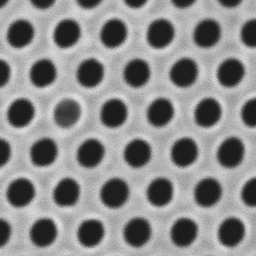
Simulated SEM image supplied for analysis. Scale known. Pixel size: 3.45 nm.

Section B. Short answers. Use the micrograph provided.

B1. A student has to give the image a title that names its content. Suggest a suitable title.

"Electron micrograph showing a regular array of holes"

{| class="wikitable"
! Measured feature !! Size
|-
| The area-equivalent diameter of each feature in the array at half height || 100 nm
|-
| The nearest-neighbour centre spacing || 158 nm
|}